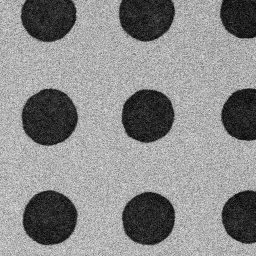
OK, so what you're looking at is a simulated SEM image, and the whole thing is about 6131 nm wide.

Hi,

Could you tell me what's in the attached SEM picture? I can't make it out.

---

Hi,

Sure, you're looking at holes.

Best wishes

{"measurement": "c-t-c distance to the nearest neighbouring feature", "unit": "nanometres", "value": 2360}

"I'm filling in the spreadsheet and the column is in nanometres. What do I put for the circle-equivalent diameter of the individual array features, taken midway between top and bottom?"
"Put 1290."